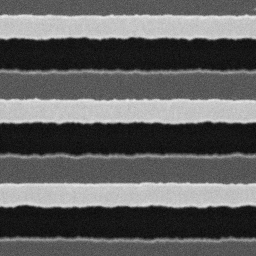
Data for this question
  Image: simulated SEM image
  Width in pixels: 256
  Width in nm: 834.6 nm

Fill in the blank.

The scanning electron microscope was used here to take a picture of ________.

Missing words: lines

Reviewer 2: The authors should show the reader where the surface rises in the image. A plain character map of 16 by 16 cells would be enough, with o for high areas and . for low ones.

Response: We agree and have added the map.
oooooooooooooooo
oooooooooooooooo
................
................
ooooooooo.oooooo
oooooooooooooooo
oooooooooooooooo
oooooooooooooooo
................
................
oooooooooooooooo
oooooooooooooooo
oooooooooooooooo
................
................
oooooooooooooooo